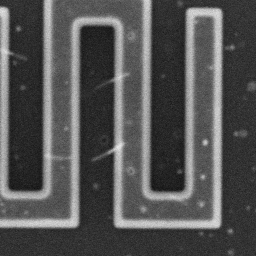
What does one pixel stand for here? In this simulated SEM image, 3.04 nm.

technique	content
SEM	groups of lines, slits or small figures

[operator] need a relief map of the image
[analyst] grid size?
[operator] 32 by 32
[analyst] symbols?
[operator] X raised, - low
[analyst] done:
------XXXXXXXXXXXX--------------
------XXXXXXXXXXXX------XXX-----
X-----XXXXXXXXXXXX------XXX-----
X-----XXXX-----XXX------XXX-----
X-----XXXX-----XXX------XXX-----
X-----XXXX-----XXX------XXX-----
X-----XXXX-----XXX------XXX-----
X-----XXXX-----XXX------XXX-----
X-----XXXX-----XXX------XXX-----
X-----XXXX-----XXX------XXX-----
X-----XXXX-----XXX------XXX-----
X-----XXXX-----XXX------XXX-----
X-----XXXX-----XXX------XXX-----
X-----XXXX-----XXX------XXX-----
X-----XXX------XXX------XXX-----
X-----XXX------XXX------XXX-----
X-----XXX------XXX------XXX-----
X-----XXX------XXX------XXX-----
X-----XXX-----XXXX------XXX-----
X-----XXX------XXX------XXX-----
X-----XXX------XXX------XXX-----
X-----XXX------XXX------XXX-----
X-----XXX------XXX------XXX-----
X-----XXX------XXX-----XXXX-----
XXXXXXXXX------XXXXXXXXXXXX-----
XXXXXXXXX------XXXXXXXXXXXX-----
XXXXXXXXX------XXXXXXXXXXXX-----
XXXXXXXXX------XXXXXXXXXXXX-----
--------------------------------
--------------------------------
--------------------------------
--------------------------------